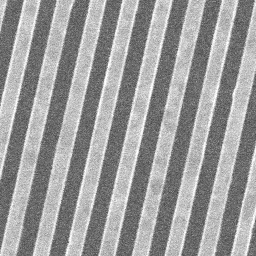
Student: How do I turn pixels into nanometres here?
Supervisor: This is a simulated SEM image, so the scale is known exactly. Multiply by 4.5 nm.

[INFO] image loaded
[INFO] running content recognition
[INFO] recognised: parallel lines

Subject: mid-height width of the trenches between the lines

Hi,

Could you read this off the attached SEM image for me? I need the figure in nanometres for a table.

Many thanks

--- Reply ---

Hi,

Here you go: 78.4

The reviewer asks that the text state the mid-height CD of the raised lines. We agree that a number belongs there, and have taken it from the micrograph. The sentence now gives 67.4 nanometers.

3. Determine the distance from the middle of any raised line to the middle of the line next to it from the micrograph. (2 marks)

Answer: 145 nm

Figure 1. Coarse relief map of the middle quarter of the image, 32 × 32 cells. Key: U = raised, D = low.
DDDUUUUDDDDUUUUDDDDUUUUDDDDDUUUU
DDDUUUUDDDDUUUUDDDDUUUUDDDDDUUUD
DDDUUUDDDDDUUUDDDDDUUUUDDDDUUUUD
DDUUUUDDDDUUUUDDDDDUUUUDDDDUUUUD
DDUUUUDDDDUUUUDDDDDUUUDDDDDUUUUD
DDUUUUDDDDUUUUDDDDUUUUDDDDDUUUDD
DDUUUDDDDDUUUUDDDDUUUUDDDDUUUUDD
DUUUUDDDDDUUUDDDDDUUUUDDDDUUUUDD
DUUUUDDDDUUUUDDDDDUUUDDDDDUUUUDD
DUUUUDDDDUUUUDDDDUUUUDDDDDUUUUDD
DUUUDDDDDUUUUDDDDUUUUDDDDDUUUDDD
DUUUDDDDDUUUDDDDDUUUUDDDDUUUUDDD
UUUUDDDDUUUUDDDDDUUUDDDDDUUUUDDD
UUUUDDDDUUUUDDDDDUUUDDDDDUUUUDDD
UUUUDDDDUUUUDDDDUUUUDDDDDUUUDDDD
UUUDDDDDUUUDDDDDUUUUDDDDUUUUDDDD
UUUDDDDDUUUDDDDDUUUUDDDDUUUUDDDD
UUUDDDDUUUUDDDDDUUUDDDDDUUUUDDDD
UUUDDDDUUUUDDDDUUUUDDDDDUUUDDDDD
UUDDDDDUUUUDDDDUUUUDDDDUUUUDDDDD
UUDDDDDUUUDDDDDUUUUDDDDUUUUDDDDD
UUDDDDUUUUDDDDDUUUDDDDDUUUUDDDDU
UUDDDDUUUUDDDDUUUUDDDDDUUUUDDDDU
UUDDDDUUUUDDDDUUUUDDDDDUUUDDDDDU
UDDDDDUUUDDDDDUUUUDDDDUUUUDDDDDU
UDDDDUUUUDDDDDUUUUDDDDUUUUDDDDUU
UDDDDUUUUDDDDDUUUDDDDDUUUUDDDDUU
UDDDDUUUUDDDDUUUUDDDDDUUUDDDDDUU
DDDDDUUUUDDDDUUUUDDDDUUUUDDDDDUU
DDDDDUUUDDDDDUUUUDDDDUUUUDDDDDUU
DDDDUUUUDDDDDUUUDDDDDUUUUDDDDUUU
DDDDUUUUDDDDUUUUDDDDDUUUUDDDDUUU